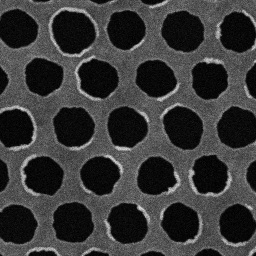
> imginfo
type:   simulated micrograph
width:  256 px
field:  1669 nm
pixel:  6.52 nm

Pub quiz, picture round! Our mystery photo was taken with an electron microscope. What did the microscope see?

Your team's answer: a regular array of holes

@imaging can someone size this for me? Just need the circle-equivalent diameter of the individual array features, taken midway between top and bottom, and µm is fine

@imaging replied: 0.253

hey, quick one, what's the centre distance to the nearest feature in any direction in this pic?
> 349 nm